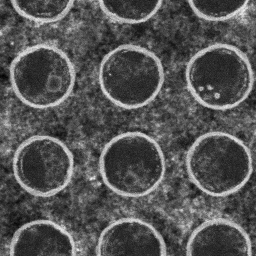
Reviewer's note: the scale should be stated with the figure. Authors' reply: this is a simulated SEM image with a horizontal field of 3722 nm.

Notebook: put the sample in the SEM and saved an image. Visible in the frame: raised bodies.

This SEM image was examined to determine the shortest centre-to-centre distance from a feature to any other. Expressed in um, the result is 1.27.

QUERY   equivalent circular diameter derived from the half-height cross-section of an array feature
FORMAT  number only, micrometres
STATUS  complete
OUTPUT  0.887